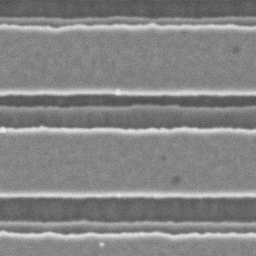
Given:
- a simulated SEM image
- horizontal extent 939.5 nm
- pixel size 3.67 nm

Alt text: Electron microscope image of lines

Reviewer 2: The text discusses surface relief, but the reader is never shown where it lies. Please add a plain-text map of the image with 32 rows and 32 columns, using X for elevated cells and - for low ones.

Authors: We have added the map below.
--------------------------------
--------------------------------
--------------------------------
XXXXXXXXXXXXXXXXXXXXXXXXXXXXXXXX
XXXXXXXXXXXXXXXXXXXXXXXXXXXXXXXX
XXXXXXXXXXXXXXXXXXXXXXXXXXXXXXXX
XXXXXXXXXXXXXXXXXXXXXXXXXXXXXXXX
XXXXXXXXXXXXXXXXXXXXXXXXXXXXXXXX
XXXXXXXXXXXXXXXXXXXXXXXXXXXXXXXX
XXXXXXXXXXXXXXXXXXXXXXXXXXXXXXXX
XXXXXXXXXXXXXXXXXXXXXXXXXXXXXXXX
XXXXXXXXXXXXXXXXXXXXXXXXXXXXXXXX
--------------------------------
--------------------------------
--------------------------------
--------------------------------
XXXXXXXXXXXXXXXXXXXXXXXXXXXXXXXX
XXXXXXXXXXXXXXXXXXXXXXXXXXXXXXXX
XXXXXXXXXXXXXXXXXXXXXXXXXXXXXXXX
XXXXXXXXXXXXXXXXXXXXXXXXXXXXXXXX
XXXXXXXXXXXXXXXXXXXXXXXXXXXXXXXX
XXXXXXXXXXXXXXXXXXXXXXXXXXXXXXXX
XXXXXXXXXXXXXXXXXXXXXXXXXXXXXXXX
XXXXXXXXXXXXXXXXXXXXXXXXXXXXXXXX
XXXXXXXXXXXXXXXXXXXXXXXXXXXXXXXX
--------------------------------
--------------------------------
--------------------------------
--------------------------------
XXXXXXXXXXXXXXXXXXXXXXXXXXXXXXXX
XXXXXXXXXXXXXXXXXXXXXXXXXXXXXXXX
XXXXXXXXXXXXXXXXXXXXXXXXXXXXXXXX